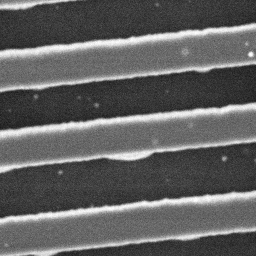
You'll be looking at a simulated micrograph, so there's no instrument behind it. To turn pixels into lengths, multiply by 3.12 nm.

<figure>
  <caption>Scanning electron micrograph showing lines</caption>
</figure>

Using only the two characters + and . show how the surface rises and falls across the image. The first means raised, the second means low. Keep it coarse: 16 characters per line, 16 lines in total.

................
................
.......+++++++++
++++++++++++++++
+++++++++++.....
++..............
................
......++++++++++
++++++++++++++++
++++++++++......
+...............
................
..........++++++
..++++++++++++++
+++++++++++++++.
++++++..........